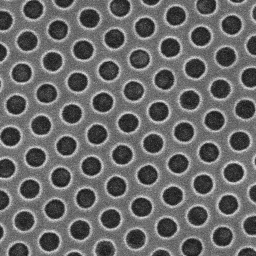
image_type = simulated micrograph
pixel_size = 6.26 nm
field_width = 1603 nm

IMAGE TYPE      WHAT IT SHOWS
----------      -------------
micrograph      a regular array of holes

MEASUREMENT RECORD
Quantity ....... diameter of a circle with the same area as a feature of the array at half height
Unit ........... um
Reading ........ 0.132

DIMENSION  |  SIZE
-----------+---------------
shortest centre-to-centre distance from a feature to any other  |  202 nanometres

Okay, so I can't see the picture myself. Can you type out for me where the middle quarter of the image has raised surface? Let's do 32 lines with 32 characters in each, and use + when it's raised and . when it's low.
+++++++++.....+++....+++++++++..
+++++++++.....++++++++++..++++..
++...++++.....+++++++++....+++..
+.....+++....++++++++++.....++++
+.....++++++++++..+++++.....++++
+.....+++++++++.....+++....+++++
++...++++++++++.....+++++++++++.
++++++++...++++.....+++++++++...
+++++++.....++++...++++++++++...
+++++++.....+++++++++++..++++...
....+++.....+++++++++.....+++...
.....+++....+++++++++.....+++++.
.....++++++++++..++++.....++++++
....++++++++++....++++....++++++
...++++++++++......+++++++++++.+
+++++++...+++......+++++++++....
++++++.....+++....+++++++++.....
++++++.....++++++++++..++++.....
..++++.....+++++++++.....+++....
...+++....++++++++++.....+++++.+
...++++++++++...++++.....+++++++
...+++++++++.....+++....++++++++
..++++++++++.....+++++++++++..++
+++++...++++.....+++++++++.....+
++++.....++++...++++++++++.....+
++++......++++++++++..++++.....+
.+++.....++++++++++....+++.....+
..+++....+++++++++......++++.+++
..++++++++++..++++.....+++++++++
..+++++++++....++++....+++++++++
.+++++++++......+++++++++++.++++
++++...++++.....+++++++++....+++